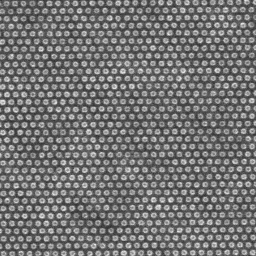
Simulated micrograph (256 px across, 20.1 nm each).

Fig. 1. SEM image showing a regular array of raised bodies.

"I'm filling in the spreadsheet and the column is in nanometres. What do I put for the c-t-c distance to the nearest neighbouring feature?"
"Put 167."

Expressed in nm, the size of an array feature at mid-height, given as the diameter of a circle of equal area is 98.7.